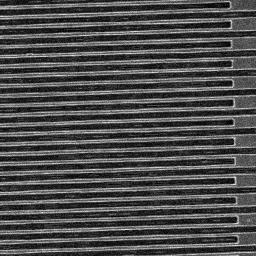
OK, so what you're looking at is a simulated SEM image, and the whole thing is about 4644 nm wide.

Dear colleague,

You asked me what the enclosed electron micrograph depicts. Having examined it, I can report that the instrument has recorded parallel lines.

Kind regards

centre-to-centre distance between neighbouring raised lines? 177 nanometers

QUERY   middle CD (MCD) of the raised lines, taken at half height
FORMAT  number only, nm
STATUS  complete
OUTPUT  61.2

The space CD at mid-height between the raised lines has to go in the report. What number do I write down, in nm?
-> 109